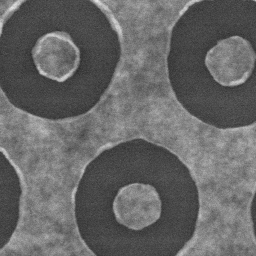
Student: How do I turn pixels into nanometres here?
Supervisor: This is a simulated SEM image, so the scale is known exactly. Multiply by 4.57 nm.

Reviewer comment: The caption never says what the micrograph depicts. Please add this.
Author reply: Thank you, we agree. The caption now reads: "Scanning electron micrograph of ring-shaped grooves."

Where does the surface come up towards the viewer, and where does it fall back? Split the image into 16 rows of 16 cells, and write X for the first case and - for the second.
X-----XXXXXX----
-------XXXX-----
---X---XXXX---X-
--XXX---XX---XXX
---XX--XXXX--XXX
-------XXXX-----
X-----XXXXX-----
XXX-XXXXXXXXX---
XXXXXXXXXXXXXXXX
XXXXXX-----XXXXX
-XXXX-------XXXX
-XXXX-------XXXX
-XXXX--XXX--XXXX
-XXXX--XXX--XXXX
-XXXX-------XXXX
XXXXXX-----XXXXX